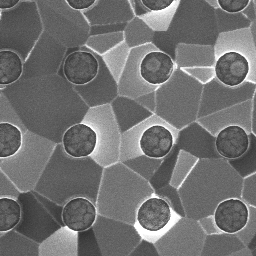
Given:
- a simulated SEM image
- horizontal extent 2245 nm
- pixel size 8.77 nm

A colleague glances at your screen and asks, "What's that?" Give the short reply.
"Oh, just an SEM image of a regular array of holes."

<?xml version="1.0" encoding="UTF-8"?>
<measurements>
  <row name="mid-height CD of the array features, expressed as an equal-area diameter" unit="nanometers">294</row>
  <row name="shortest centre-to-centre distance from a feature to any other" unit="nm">643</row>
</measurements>